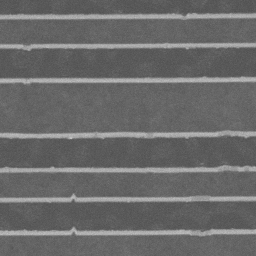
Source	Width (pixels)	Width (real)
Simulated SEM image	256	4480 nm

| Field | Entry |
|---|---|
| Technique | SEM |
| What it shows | one or a few lines or trenches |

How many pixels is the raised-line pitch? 76.4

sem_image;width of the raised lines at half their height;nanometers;601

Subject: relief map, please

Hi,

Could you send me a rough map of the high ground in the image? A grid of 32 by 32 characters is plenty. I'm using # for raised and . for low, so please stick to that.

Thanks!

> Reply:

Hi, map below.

################################
################################
................................
................................
................................
................................
################################
################################
################################
################################
................................
................................
................................
................................
................................
................................
................................
################################
################################
################################
################################
................................
................................
................................
................................
################################
################################
################################
################################
................................
................................
................................